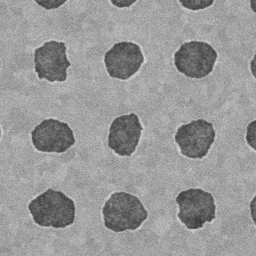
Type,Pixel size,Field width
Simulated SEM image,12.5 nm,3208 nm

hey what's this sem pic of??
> a regular array of holes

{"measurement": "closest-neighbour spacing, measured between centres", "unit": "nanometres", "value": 881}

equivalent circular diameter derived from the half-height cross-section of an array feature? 493 nm